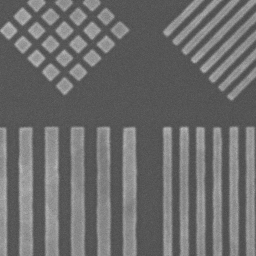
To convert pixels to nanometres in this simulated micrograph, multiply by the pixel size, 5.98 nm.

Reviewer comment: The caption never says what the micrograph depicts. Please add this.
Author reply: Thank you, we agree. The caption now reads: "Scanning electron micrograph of groups of lines, slits or small figures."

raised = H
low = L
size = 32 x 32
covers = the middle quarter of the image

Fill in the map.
LLLHLLLLLLLLLLLLLLLLLLLLLLLLLLLL
LLHHHLLLLLLLLLLLLLLLLLLLLLLLLLLL
LLHHHLLLLLLLLLLLLLLLLLLLLLLLLLLL
LLLHLLLLLLLLLLLLLLLLLLLLLLLLLLLL
HLLLLLLLLLLLLLLLLLLLLLLLLLLLLLLL
HHLLLLLLLLLLLLLLLLLLLLLLLLLLLLLL
HLLLLLLLLLLLLLLLLLLLLLLLLLLLLLLL
LLLLLLLLLLLLLLLLLLLLLLLLLLLLLLLL
LLLLLLLLLLLLLLLLLLLLLLLLLLLLLLLL
LLLLLLLLLLLLLLLLLLLLLLLLLLLLLLLL
LLLLLLLLLLLLLLLLLLLLLLLLLLLLLLLL
LLLLLLLLLLLLLLLLLLLLLLLLLLLLLLLL
LLLLLLLLLLLLLLLLLLLLLLLLLLLLLLLL
LLLLLLLLLLLLLLLLLLLLLLLLLLLLLLLL
LLLLLLLLLLLLLLLLLLLLLLLLLLLLLLLL
LLLLLLLLLLLLLLLLLLLLLLLLLLLLLLLL
LLHHHLLLHHHLLLLHHLLLLLLLLHHLLHHL
LLHHHLLLHHHLLLLHHLLLLLLLLHHLLHHL
LLHHHLLLHHHLLLLHHHLLLLLLLHHLLHHL
LLHHHLLLHHHLLLLHHHLLLLLLLHHLLHHL
LLHHHLLLHHHLLLLHHHLLLLLLLHHLLHHL
LLHHHLLLHHHLLLLHHHLLLLLLLHHLLHHL
LLHHHLLLHHHLLLLHHHLLLLLLLHHLLHHL
LLHHHLLLHHHLLLLHHHLLLLLLLHHLLHHL
LLHHHLLLHHHLLLLHHHLLLLLLLHHLLHHL
LLHHHLLLLHHLLLLHHHLLLLLLLHHLLHHL
LLHHHLLLLHHLLLLHHHLLLLLLLHHLLHHL
LLHHHLLLLHHLLLLHHHLLLLLLLHHLLHHL
LLHHHLLLHHHLLLLHHHLLLLLLLHHLLHHL
LLHHHLLLHHHLLLLHHHLLLLLLLHHLLHHL
LLHHHLLLHHHLLLLHHHLLLLLLLHHLLHHL
LLHHHLLLHHHLLLLHHHLLLLLLLHHLLHHL